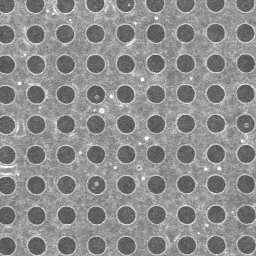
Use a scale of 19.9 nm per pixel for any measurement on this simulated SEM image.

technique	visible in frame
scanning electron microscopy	a regular array of holes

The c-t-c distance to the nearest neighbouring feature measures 593 nanometres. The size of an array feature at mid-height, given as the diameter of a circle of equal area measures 367 nm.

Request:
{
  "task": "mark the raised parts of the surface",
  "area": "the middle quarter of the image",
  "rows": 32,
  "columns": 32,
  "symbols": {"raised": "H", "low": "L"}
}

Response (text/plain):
LLLHHHLLLLHHHLLLLLHHHLLLLHHHLLLL
LLHHHHLLLLHHHHLLLHHHHLLLLHHHHLLL
LHHHHHHHHHHHHHHHHHHHHHHHHHHHHHHH
HHHHHHHHHHHHHHHHHHHHHHHHHHHHHHHH
HHHHHHHHHHHHHHHHHHHHHHHHHHHHHHHH
LHHHHHHLHHHHHHLLHHHHHHLLHHHHHLLL
LLHHHHLLLLHHHLLLLHHHHLLLLHHHLLLL
LLLHHHLLLLHHHLLLLLHHHLLLLHHHLLLL
LLLHHHLLLLHHHLLLLHHHHLLLLHHHHLLL
LLHHHHHLLHHHHHLLLHHHHHLLHHHHHLLL
HHHHHHHHHHHHHHHHHHHHHHHHHHHHHHHH
HHHHHHHHHHHHHHHHHHHHHHHHHHHHHHHH
HHHHHHHHHHHHHHHHHHHHHHHHHHHHHHHH
LLHHHHLLLHHHHHLLLHHHHLLLLHHHHLLL
LLLHHHLLLLHHHLLLLLHHHLLLLHHHLLLL
LLLHHHLLLLHHHLLLLLHHHLLLLHHHLLLL
LLHHHHLLLLHHHHLLLLHHHLLLLHHHHLLL
LHHHHHHHLHHHHHHHHHHHHHHHHHHHHHHH
HHHHHHHHHHHHHHHHHHHHHHHHHHHHHHHH
HHHHHHHHHHHHHHHHHHHHHHHHHHHHHHHH
LHHHHHHLLHHHHHHLHHHHHHLLHHHHHLLL
LLLHHHLLLLHHHHLLLLHHHLLLLHHHLLLL
LLLHHHLLLLHHHLLLLLHHHLLLLHHHLLLL
LLLHHHLLLLHHHLLLLLHHHLLLLHHHLLLL
LLHHHHHLLHHHHHLLLHHHHHLLHHHHHLLL
HHHHHHHHHHHHHHHHHHHHHHHHHHHHHHHH
HHHHHHHHHHHHHHHHHHHHHHHHHHHHHHHH
HHHHHHHHHHHHHHHHHHHHHHHHHHHHHHHH
LLHHHHLLLLHHHHLLLHHHHHLLLHHHHLLL
LLLHHHLLLLHHHLLLLLHHHLLLLHHHLLLL
LLLHHHLLLLHHHLLLLLHHHLLLLHHHLLLL
LLLHHHLLLLHHHHLLLLHHHLLLLHHHHLLL